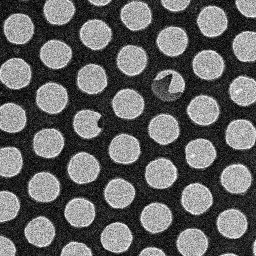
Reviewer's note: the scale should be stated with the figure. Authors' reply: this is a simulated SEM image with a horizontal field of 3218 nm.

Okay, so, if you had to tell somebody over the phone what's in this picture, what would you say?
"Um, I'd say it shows a regular array of raised bodies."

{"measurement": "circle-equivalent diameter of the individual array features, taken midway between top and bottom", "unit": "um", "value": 0.387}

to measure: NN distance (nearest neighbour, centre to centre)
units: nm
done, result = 549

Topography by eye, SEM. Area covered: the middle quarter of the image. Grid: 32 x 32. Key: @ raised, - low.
-----@@@@----@@@@@@@------------
----@@@@@@----@@@@@@------@-----
----@@@@@@-----@@@@-----@@@@@---
---@@@@@@@@------------@@--@@@--
---@@@@@@@@----------------@@@--
----@@@@@@@---------------@@@@--
----@@@@@@-----@@---------@@@@--
@-----@------@@@@@@-------------
@-----------@@@@@@@@------------
@-----------@@@@@@@@------------
------------@@@@@@@@-----------@
-----@------@@@@@@@@-----------@
---@@@@@@----@@@@@@------------@
---@@@@@@------@@@----@@@@@@----
--@@@@@@--------------@@@@@@----
--@@@@@@-------------@@@@@@@@---
---@@@@@@------------@@@@@@@@---
----@@@@@------------@@@@@@@@---
-----@@------@@@@@----@@@@@@----
------------@@@@@@@----@@@@----@
-----------@@@@@@@@------------@
-----------@@@@@@@@-----------@@
---@@@-----@@@@@@@@-----------@@
--@@@@@@----@@@@@@------@------@
-@@@@@@@@----@@@@-----@@@@@----@
-@@@@@@@@------------@@@@@@@----
-@@@@@@@@-----------@@@@@@@@----
-@@@@@@@@-----------@@@@@@@@----
--@@@@@@------------@@@@@@@@----
---@@@@----@@@@@-----@@@@@@-----
-----------@@@@@@-----@@@@@----@
----------@@@@@@@@------------@@